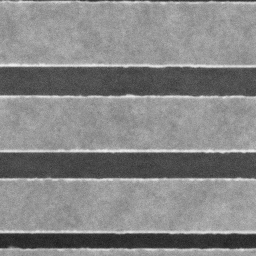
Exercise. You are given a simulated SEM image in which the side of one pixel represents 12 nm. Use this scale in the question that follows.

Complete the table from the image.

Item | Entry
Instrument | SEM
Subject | lines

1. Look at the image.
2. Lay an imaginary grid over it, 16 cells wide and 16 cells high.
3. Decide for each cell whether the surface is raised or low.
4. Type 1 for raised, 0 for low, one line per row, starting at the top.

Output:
1111111111111111
1111111111111111
1111111111111111
1111111111111111
0000000000000000
0000000000000000
1111111111111111
1111111111111111
1111111111111111
0000000000000000
0000000000000000
1111111111111111
1111111111111111
1111111111111111
1111111111111111
0000000000000000